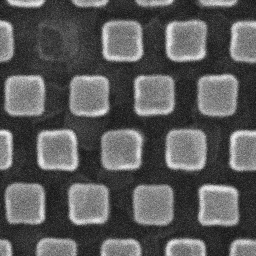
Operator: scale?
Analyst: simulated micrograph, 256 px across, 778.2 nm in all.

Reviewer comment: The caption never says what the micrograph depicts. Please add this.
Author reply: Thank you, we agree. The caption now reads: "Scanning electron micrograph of a regular array of raised bodies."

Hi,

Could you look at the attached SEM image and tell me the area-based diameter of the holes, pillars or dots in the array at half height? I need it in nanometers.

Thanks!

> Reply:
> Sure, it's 129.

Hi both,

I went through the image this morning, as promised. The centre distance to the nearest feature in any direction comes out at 0.191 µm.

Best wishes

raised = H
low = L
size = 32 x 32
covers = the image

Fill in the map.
LLHHHLLLLLHHHLLLLHHHHLLLLHHHHLLL
LLLLLLLLLLLLLLLLLLLLLLLLLLLLLLLL
LLLLLLLLLLLLLLLLLLLLLLLLLLLLLLLL
HLLLLLLLLLLLLHHHHHLLLHHHHHLLLHHH
HLLLLLLLLLLLLHHHHHLLLHHHHHLLLHHH
HLLLLLLLLLLLLHHHHHLLLHHHHHLLLHHH
HLLLLLLLLLLLLHHHHHLLLHHHHHLLLHHH
HLLLLLLLLLLLLLHLLLLLLLLLLLLLLLHH
LLLLLLLLLLLLLLLLLLLLLLLLLLLLLLLL
LLLLLLLLLLLLLLLLLLLHLLLLLLHHHLLL
LHHHHLLLLHHHHHLLLHHHHHLLLHHHHHLL
LHHHHLLLLHHHHHLLLHHHHHLLLHHHHLLL
LHHHHLLLLHHHHLLLLHHHHHLLLHHHHLLL
LHHHHLLLLHHHHLLLLHHHHHLLLHHHHLLL
LLLLLLLLLLHHLLLLLLLLLLLLLLLLLLLL
LLLLLLLLLLLLLLLLLLLLLLLLLLLLLLLL
HLLLLLLHHLLLLLHHHLLLLLHHHLLLLHHH
HLLLLHHHHLLLLHHHHHLLLHHHHHLLLHHH
HLLLLHHHHLLLLHHHHHLLLHHHHHLLLHHH
HLLLLHHHHHLLLHHHHHLLLHHHHHLLLHHH
HLLLLHHHHHLLLHHHHHLLLHHHHLLLLHHH
LLLLLLLLLLLLLLLLLLLLLLLLLLLLLLLL
LLLLLLLLLLLLLLLLLLLLLLLLLLLLLLLL
LHHHHLLLLHHHHLLLLHHHHLLLLHHHHLLL
LHHHHLLLLHHHHLLLLHHHHLLLLHHHHHLL
LHHHHLLLLHHHHHLLLHHHHLLLLHHHHHLL
LHHHHLLLLHHHHHLLLHHHHHLLLHHHHHLL
LHHHHLLLLHHHHLLLLHHHHLLLLHHHHHLL
LLLLLLLLLLLLLLLLLLLLLLLLLLLLLLLL
LLLLLLLLLLLLLLLLLLLLLLLLLLLLLLLL
HLLLLHHHHLLLLHHHHLLLLHHHHLLLLHHH
HLLLLHHHHHLLLHHHHHLLLHHHHHLLLHHH